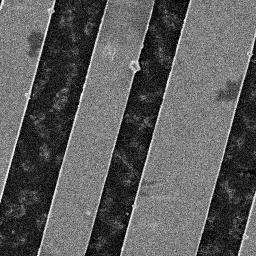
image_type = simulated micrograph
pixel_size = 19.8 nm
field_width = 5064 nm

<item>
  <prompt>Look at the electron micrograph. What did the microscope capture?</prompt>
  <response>one or a few lines or trenches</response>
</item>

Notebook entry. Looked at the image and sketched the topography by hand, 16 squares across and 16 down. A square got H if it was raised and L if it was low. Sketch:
HHHLLLLHHHLLHHHH
HHHLLLHHHLLHHHHH
HHHLLLHHHLLHHHHH
HHLLLLHHHLLHHHHH
HHLLLHHHHLLHHHHL
HHLLLHHHLLHHHHHL
HHLLLHHHLLHHHHHL
HLLLLHHHLLHHHHHL
HLLLHHHLLLHHHHLL
HLLLHHHLLHHHHHLL
HLLLHHHLLHHHHHLL
LLLLHHLLLHHHHLLL
LLLHHHLLHHHHHLLL
LLLHHHLLHHHHHLLL
LLLHHHLLHHHHHLLH
LLHHHLLLHHHHLLLH